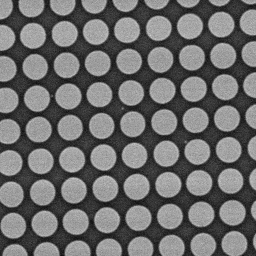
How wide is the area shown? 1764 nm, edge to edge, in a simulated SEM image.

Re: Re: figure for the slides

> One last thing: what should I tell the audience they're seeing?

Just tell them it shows an array of small figures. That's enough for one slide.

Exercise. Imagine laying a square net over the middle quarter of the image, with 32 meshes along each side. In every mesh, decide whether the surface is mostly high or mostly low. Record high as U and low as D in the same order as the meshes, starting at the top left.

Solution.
UUUUDUUUUUUDDUUUUUUDDDUUUUUDDDUU
UUUDDDUUUUUDDDUUUUDDDDUUUUDDDDDD
UUUDDDDUUUDDDDDDDDDDDDDDDDDDDDDD
DDDDDDDDDDDDDDDDDDDDDDDDDDDDDDDU
DDDDDDDDDDDDDDDUUUDDDDUUUUUDDDUU
UUUDDDDUUUUDDDUUUUUDDDUUUUUUDUUU
UUUUDDUUUUUUDDUUUUUUDDUUUUUUDUUU
UUUUDDUUUUUUDDUUUUUUDDUUUUUUDDUU
UUUUDDUUUUUUDDUUUUUUDDUUUUUDDDUU
UUUUDDUUUUUDDDDUUUUDDDDUUUDDDDDD
UUUDDDDDUUDDDDDDDDDDDDDDDDDDDDDD
DDDDDDDDDDDDDDDDDDDDDDDDDUDDDDDU
DDDDDDDDUUDDDDDUUUUDDDDUUUUDDDUU
UUUDDDDUUUUUDDDUUUUUDDUUUUUUDDUU
UUUUDDUUUUUUDDUUUUUUDDUUUUUUDDUU
UUUUDDUUUUUUDDUUUUUUDDUUUUUUDDUU
UUUUDDDUUUUUDDUUUUUUDDDUUUUDDDDU
UUUUDDDUUUUUDDDUUUUDDDDDUUDDDDDD
UUUDDDDDDUDDDDDDDDDDDDDDDDDDDDDD
DDDDDDDDDDDDDDDDDDDDDDDDDUUDDDDU
DDDDDDDDDUUDDDDDUUUUDDDUUUUUDDDU
UUUUDDDUUUUUDDDUUUUUDDDUUUUUUDUU
UUUUUDDUUUUUUDDUUUUUUDDUUUUUUDUU
UUUUUDDUUUUUUDDUUUUUUDDUUUUUDDDU
UUUUUDDUUUUUUDDUUUUUDDDUUUUUDDDD
UUUUUDDDUUUUDDDDUUUDDDDDDDDDDDDD
UUUUDDDDDUUDDDDDDDDDDDDDDDDDDDDD
DDDDDDDDDDDDDDDDDDDDDDDDDUUUDDDD
DDUDDDDDDUUUDDDDUUUUDDDUUUUUUDDU
UUUUUDDDUUUUUDDUUUUUUDDUUUUUUDDU
UUUUUDDUUUUUUDDUUUUUUDDUUUUUUDDU
UUUUUUDUUUUUUDDUUUUUUDDUUUUUUDDU